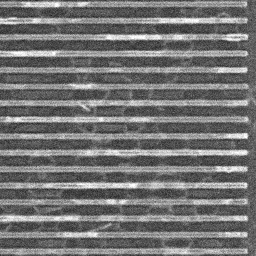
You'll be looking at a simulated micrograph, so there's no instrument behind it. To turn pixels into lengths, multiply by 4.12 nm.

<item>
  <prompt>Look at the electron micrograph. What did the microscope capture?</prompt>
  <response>parallel lines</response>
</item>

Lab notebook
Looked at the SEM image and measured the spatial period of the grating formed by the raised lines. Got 68 nm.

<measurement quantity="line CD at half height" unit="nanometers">19.6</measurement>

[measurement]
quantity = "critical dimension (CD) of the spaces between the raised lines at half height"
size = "12.1 pixels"